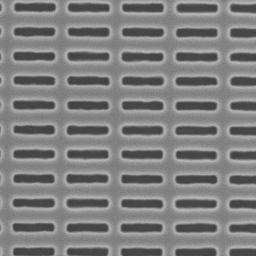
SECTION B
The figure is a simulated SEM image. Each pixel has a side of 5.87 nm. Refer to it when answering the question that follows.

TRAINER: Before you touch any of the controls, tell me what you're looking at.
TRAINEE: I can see a regular array of holes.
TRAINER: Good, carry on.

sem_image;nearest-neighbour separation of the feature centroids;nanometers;142